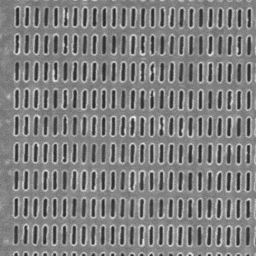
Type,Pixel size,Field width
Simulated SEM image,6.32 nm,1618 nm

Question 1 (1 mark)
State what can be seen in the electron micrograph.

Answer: a regular array of holes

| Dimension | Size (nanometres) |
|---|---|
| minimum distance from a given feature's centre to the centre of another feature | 60.4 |